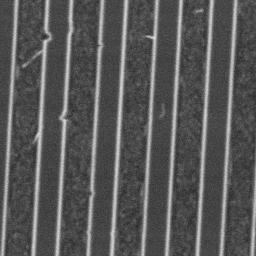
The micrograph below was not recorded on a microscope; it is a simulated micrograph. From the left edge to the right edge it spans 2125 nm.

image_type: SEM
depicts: parallel lines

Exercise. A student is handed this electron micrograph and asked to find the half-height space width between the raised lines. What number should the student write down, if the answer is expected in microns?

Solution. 0.248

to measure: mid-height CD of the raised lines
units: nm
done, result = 207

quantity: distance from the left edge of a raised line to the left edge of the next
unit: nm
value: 454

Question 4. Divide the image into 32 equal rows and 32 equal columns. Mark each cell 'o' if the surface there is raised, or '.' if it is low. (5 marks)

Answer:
oo....ooo....ooo....ooo...ooo...
oo....ooo....ooo....ooo...ooo...
oo....ooo....ooo...oooo...ooo...
oo....ooo....ooo...ooo....ooo...
oo....ooo....ooo...ooo....ooo...
oo....ooo....oo....ooo....ooo...
oo....ooo...ooo....ooo....ooo...
oo....oo....ooo....ooo....ooo...
oo...ooo....ooo....ooo....ooo...
oo...ooo....ooo....ooo....ooo...
o....ooo....ooo....ooo....ooo...
o....ooo....ooo....ooo....ooo...
o....ooo....ooo....ooo....ooo...
o....ooo....ooo....ooo....ooo...
o....ooo....ooo....ooo....ooo...
o....ooo....ooo....ooo....ooo...
o....ooo....ooo....ooo....ooo...
o....ooo....ooo....ooo...oooo...
o....ooo....ooo....ooo...ooo....
o....ooo....ooo...oooo...ooo....
o....ooo....ooo...ooo....ooo....
o....ooo....ooo...ooo....ooo....
o....ooo....ooo...ooo....ooo....
o....ooo....oo....ooo....ooo....
o....ooo...ooo....ooo....ooo....
o....oo....ooo....ooo....ooo....
o...ooo....ooo....ooo....ooo....
....ooo....ooo....ooo....ooo....
....ooo....ooo....ooo....ooo....
....ooo....ooo....ooo....ooo....
....ooo....ooo....ooo....ooo....
....ooo....ooo....ooo....ooo....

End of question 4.